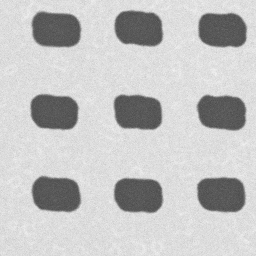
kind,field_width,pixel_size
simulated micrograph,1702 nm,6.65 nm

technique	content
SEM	a regular array of holes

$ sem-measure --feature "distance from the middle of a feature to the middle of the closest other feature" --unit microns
0.547